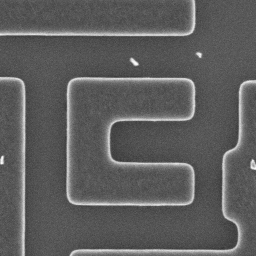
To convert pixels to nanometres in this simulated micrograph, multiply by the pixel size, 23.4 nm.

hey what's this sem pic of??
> wiring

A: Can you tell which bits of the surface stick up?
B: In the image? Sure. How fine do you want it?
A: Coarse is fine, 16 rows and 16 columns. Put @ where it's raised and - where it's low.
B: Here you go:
@@@@@@@@@@@@----
@@@@@@@@@@@@----
----------------
----------------
----------------
@@--@@@@@@@@---@
@@--@@@@@@@@---@
@@--@@@@-@-----@
@@--@@@--------@
@@--@@@-------@@
@@--@@@@@@@@--@@
@@--@@@@@@@@--@@
@@--@@@@@@@@--@@
@@------------@@
@@-------------@
@@------------@@